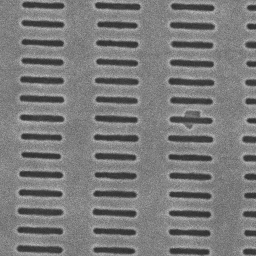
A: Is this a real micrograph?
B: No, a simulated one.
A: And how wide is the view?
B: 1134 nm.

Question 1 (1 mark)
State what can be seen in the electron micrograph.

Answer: a regular array of holes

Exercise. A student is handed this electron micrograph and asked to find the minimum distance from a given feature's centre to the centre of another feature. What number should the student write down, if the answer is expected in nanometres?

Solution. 82.7